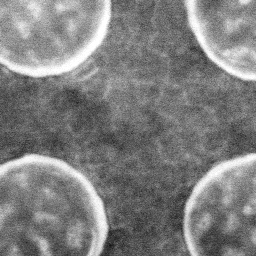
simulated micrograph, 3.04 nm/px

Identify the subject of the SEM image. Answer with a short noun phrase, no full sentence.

raised bodies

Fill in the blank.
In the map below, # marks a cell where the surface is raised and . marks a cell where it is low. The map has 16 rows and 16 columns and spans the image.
#######.....####
#######.....####
######......####
#####........###
..##..........##
................
................
................
................
................
####..........##
######.......###
######......####
######......####
#######.....####
######......####